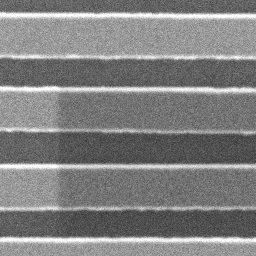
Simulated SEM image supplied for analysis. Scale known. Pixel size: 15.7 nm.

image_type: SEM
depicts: lines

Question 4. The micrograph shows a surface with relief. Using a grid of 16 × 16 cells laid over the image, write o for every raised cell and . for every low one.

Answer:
................
oooooooooooooooo
oooooooooooooooo
oooooooooooooooo
................
o..o............
oooooooooooooooo
oooooooooooooooo
................
................
oooooooooooooooo
oooooooooooooooo
oooooooooooooooo
................
................
oooooooooooooooo